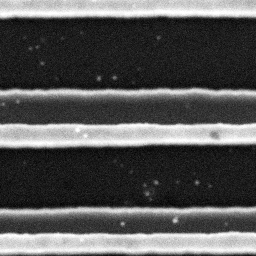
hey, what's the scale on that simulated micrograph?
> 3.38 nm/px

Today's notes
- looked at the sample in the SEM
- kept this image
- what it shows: lines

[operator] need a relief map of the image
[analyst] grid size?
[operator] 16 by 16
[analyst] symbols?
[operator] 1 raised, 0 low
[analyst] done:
1111111111111111
0000000000000000
0000000000000000
0000000000000000
0000000000000000
0000000000000000
1111111111111111
1111111111111111
1111111111111111
0000000000000000
0000000000000000
0000000000000000
0000000000000000
1111111111111111
1111111111111111
1111111111111111